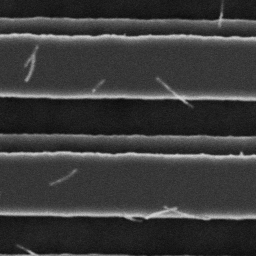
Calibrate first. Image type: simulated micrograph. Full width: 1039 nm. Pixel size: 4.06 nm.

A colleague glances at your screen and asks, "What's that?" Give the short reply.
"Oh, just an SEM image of lines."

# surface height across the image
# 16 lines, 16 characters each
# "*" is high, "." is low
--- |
................
****************
****************
****************
****************
****************
................
................
*****...........
****************
****************
****************
****************
.......*********
................
................